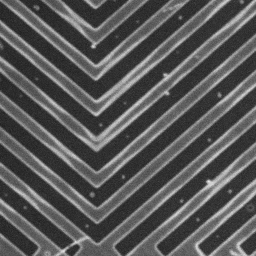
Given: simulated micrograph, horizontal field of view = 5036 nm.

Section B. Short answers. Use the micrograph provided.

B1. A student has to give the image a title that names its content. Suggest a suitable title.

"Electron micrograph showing groups of lines, slits or small figures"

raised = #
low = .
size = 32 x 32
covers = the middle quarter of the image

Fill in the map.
....#######........###.......###
.....#####........###.......####
......####......####.......####.
#......##......####......####...
##............###.......####....
###..........###.......####.....
#####.......###.......####......
.#####.....###.......####......#
..#####...###.......####......##
....########.......####.....####
.....######......#####.....#####
......####......####......#####.
#......##......####......#####..
##............####......####....
####.........####......####.....
#####.......####......####......
.#####.....###.......####......#
...####...###.......####......##
....########......####......####
.....######......#####......####
.......##.......####......#####.
#..............####......#####..
##............####......#####...
####.........###.......####.....
.####.......###.......####......
..####....####.......####......#
...####..####......#####......##
....########......#####......###
.....######......#####......####
......####......####......#####.
##......#......####......#####..
##............####......####....